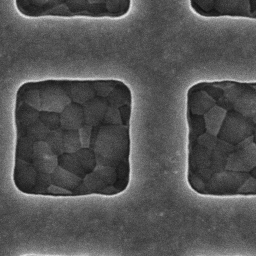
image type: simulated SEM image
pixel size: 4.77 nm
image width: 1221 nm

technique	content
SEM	holes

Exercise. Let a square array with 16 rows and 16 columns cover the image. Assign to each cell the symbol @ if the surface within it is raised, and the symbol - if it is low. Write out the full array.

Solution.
@-------@@@@----
@@@@@@@@@@@@@@@@
@@@@@@@@@@@@@@@@
@@@@@@@@@@@@@@@@
@@@@@@@@@@@@@@@@
@-------@@@@----
@-------@@@@----
@-------@@@@----
@-------@@@@----
@-------@@@@----
@-------@@@@----
@-------@@@@----
@@@@@@@@@@@@@@@@
@@@@@@@@@@@@@@@@
@@@@@@@@@@@@@@@@
@@@@@@@@@@@@@@@@